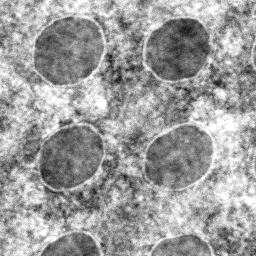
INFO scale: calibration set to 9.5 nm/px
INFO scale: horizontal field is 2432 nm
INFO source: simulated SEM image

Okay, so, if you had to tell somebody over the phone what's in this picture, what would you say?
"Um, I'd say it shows raised bodies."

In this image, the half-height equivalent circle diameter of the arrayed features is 640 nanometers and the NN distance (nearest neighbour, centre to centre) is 1020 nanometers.